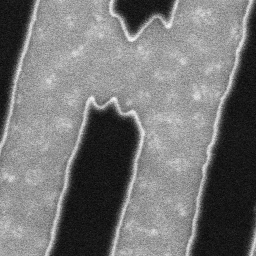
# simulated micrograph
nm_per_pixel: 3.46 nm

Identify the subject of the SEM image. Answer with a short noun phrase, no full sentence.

one or a few lines or trenches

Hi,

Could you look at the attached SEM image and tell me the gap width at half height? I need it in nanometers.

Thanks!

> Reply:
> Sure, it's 246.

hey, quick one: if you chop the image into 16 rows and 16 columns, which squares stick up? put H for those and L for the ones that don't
HHLLLLLHHHHLLLLH
HHLLLLLLHLLLLLLH
HHLLLLLLLLLLLLLH
HLLLLLLLLLLLLLLH
HLLLLLLLLLLLLLLH
HLLLLLLLLLLLLLHH
HLLLLLLLLLLLLLHH
HLLLLHHHHLLLLLHH
LLLLLHHHHLLLLHHH
LLLLLHHHHLLLLHHH
LLLLHHHHLLLLLHHH
LLLLHHHHLLLLLHHH
LLLLHHHHLLLLHHHH
LLLLHHHHLLLLHHHH
LLLHHHHLLLLLHHHH
LLLHHHHLLLLLHHHH